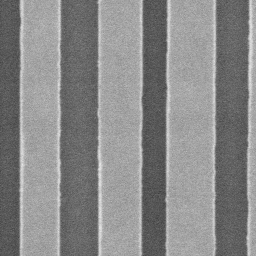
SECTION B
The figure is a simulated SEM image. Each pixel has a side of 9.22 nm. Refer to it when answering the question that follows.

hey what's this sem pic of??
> lines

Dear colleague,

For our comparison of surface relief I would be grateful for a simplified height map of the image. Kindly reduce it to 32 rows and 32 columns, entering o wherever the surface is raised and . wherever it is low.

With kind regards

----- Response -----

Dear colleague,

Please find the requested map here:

...oooo.....oooooo...oooooo....o
...oooo.....oooooo...oooooo....o
...oooo.....oooooo...oooooo....o
...oooo.....oooooo...oooooo....o
...oooo.....oooooo...oooooo....o
...oooo.....oooooo...oooooo....o
...oooo.....oooooo...oooooo....o
...oooo.....oooooo...oooooo....o
...oooo.....oooooo...oooooo....o
...oooo.....oooooo...oooooo....o
...oooo.....oooooo...oooooo....o
...oooo.....oooooo...oooooo....o
...oooo.....oooooo...oooooo....o
...oooo.....oooooo...oooooo....o
...oooo.....oooooo...oooooo....o
...oooo.....oooooo...oooooo....o
...oooo.....oooooo...oooooo....o
...oooo.....oooooo...oooooo....o
...oooo.....oooooo...oooooo....o
...oooo.....oooooo...oooooo....o
...oooo.....oooooo...oooooo....o
...oooo.....oooooo...oooooo....o
...oooo.....oooooo...oooooo....o
...oooo.....oooooo...oooooo....o
...oooo.....oooooo...oooooo....o
...oooo.....oooooo...oooooo....o
...oooo.....oooooo...oooooo....o
...oooo.....oooooo...oooooo....o
...oooo.....oooooo...oooooo....o
...oooo.....oooooo...oooooo....o
...oooo.....oooooo...oooooo....o
...oooo.....oooooo...oooooo....o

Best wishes